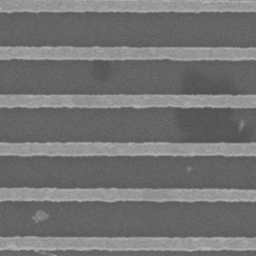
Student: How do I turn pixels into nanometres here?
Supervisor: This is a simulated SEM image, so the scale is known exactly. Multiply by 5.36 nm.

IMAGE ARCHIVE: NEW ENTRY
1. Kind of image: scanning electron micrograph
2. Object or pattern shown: lines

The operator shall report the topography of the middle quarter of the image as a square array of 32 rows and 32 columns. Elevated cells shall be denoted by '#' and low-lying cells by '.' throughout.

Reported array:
................................
................................
................................
................................
................................
................................
................................
................................
################################
################################
######################.###.#####
................................
................................
................................
................................
................................
................................
................................
................................
................................
################################
################################
################################
................................
................................
................................
................................
................................
................................
................................
................................
################################